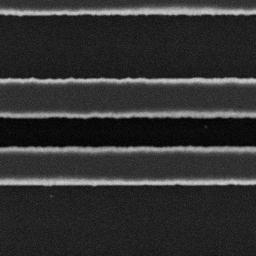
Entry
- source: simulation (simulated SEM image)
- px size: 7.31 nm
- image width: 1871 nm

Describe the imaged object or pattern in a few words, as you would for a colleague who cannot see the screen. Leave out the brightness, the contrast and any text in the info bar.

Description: lines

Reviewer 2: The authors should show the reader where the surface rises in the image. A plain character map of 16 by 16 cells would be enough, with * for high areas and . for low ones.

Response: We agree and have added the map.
****************
................
................
................
................
****************
****************
................
................
****************
****************
***********.**.*
................
................
................
................